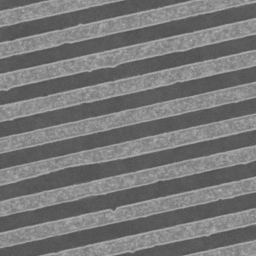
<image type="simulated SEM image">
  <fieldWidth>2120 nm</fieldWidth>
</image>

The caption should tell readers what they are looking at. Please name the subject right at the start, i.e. parallel lines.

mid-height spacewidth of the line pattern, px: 16.4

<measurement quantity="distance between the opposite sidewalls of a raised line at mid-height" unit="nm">119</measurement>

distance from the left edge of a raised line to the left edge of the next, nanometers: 256